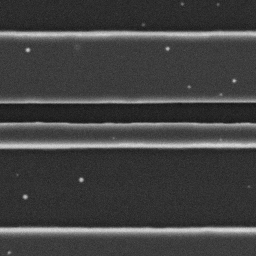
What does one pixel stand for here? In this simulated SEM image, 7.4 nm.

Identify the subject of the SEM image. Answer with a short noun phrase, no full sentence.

lines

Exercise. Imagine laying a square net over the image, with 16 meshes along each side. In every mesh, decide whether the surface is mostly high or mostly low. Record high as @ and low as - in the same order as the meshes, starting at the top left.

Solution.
----------------
----------------
@@@@@@@@@@@@@@@@
@@@@@@@@@@@@@@@@
@@@@@@@@@@@@@@@@
@@@@@@@@@@@@@@@@
@@@@@@@@@@@@@@@@
@@@@@@@@@@@@@@@@
@@@@@@@@@@@@@@@@
----------------
----------------
----------------
----------------
----------------
@@@@@@@@@@@@@@@@
@@@@@@@@@@@@@@@@